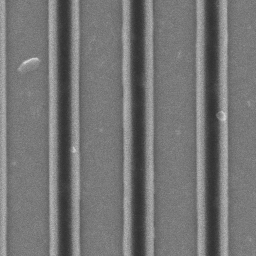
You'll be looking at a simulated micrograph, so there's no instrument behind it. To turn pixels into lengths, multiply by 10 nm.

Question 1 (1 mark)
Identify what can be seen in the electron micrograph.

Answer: one or a few lines or trenches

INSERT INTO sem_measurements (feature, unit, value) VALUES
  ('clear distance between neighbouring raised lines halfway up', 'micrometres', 0.501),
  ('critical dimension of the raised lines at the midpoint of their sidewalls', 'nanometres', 242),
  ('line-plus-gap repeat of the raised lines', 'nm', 740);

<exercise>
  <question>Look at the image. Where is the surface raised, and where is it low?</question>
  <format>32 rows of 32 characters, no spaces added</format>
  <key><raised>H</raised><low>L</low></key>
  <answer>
LLLLLLLHHHLLLLLLHHHLLLLLLHHHLLLL
LLLLLLLHHHLLLLLLHHHLLLLLLHHHLLLL
LLLLLLLHHHLLLLLLHHHLLLLLLHHHLLLL
LLLLLLLHHHLLLLLLHHHLLLLLLHHHLLLL
LLLLLLLHHHLLLLLLHHHLLLLLLHHHLLLL
LLLLLLLHHHLLLLLLHHHLLLLLLHHHLLLL
LLLLLLLHHHLLLLLLHHHLLLLLLHHHLLLL
LLLLLLLHHHLLLLLLHHHLLLLLLHHHLLLL
LLLLLLLHHLLLLLLLHHHLLLLLLHHHLLLL
LLLLLLLHHLLLLLLLHHHLLLLLLHHHLLLL
LLLLLLLHHLLLLLLLHHHLLLLLLHHHLLLL
LLLLLLLHHLLLLLLLHHHLLLLLLHHHLLLL
LLLLLLLHHLLLLLLLHHHLLLLLLHHHLLLL
LLLLLLLHHLLLLLLLHHHLLLLLLHHHLLLL
LLLLLLLHHLLLLLLLHHHLLLLLLHHHLLLL
LLLLLLLHHLLLLLLLHHHLLLLLLHHHLLLL
LLLLLLLHHLLLLLLLHHHLLLLLLHHHLLLL
LLLLLLLHHLLLLLLLHHHLLLLLLHHHLLLL
LLLLLLLHHLLLLLLLHHHLLLLLLHHHLLLL
LLLLLLLHHLLLLLLLHHHLLLLLLHHHLLLL
LLLLLLLHHLLLLLLLHHHLLLLLLHHHLLLL
LLLLLLLHHHLLLLLLHHHLLLLLLHHHLLLL
LLLLLLLHHHLLLLLLHHHLLLLLLHHHLLLL
LLLLLLLHHHLLLLLLHHHLLLLLLHHHLLLL
LLLLLLLHHHLLLLLLHHHLLLLLLHHHLLLL
LLLLLLLHHHLLLLLLHHHLLLLLLHHHLLLL
LLLLLLLHHHLLLLLLHHHLLLLLLHHHLLLL
LLLLLLLHHHLLLLLLHHHLLLLLLHHHLLLL
LLLLLLLHHHLLLLLLHHHLLLLLLHHHLLLL
LLLLLLLHHHLLLLLLHHHLLLLLLHHHLLLL
LLLLLLLHHHLLLLLLHHHLLLLLLHHHLLLL
LLLLLLLHHHLLLLLLHHHLLLLLLHHHLLLL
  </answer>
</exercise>